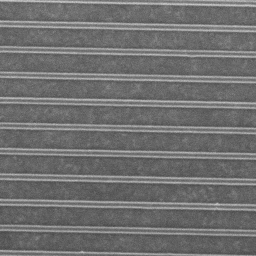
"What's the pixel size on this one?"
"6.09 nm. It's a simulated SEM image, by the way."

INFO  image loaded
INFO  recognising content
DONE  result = parallel lines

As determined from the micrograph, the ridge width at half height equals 31.2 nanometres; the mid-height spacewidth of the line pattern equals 124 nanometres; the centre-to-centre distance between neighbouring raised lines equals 155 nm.